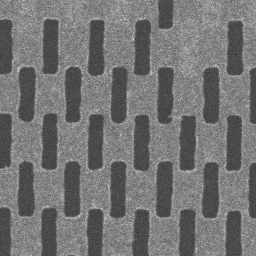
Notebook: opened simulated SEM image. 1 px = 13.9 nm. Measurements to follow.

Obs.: a regular array of holes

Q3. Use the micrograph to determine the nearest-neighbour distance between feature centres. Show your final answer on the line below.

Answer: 642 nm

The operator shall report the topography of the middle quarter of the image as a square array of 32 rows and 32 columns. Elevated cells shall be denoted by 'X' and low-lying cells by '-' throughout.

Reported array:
XXXXXX----XXXXXXX-----XXXXXXXXXX
X---XX----XX----X-----X----XXXXX
----XX----XX----X----XX-----XXXX
-----XXXXXXX----XXXXXXX-----XXXX
----XXXXXXXX----XXXXXXX-----XXXX
----XXXXXXXX----XXXXXXXX---XXXXX
----XXXXXXXX----XXXXXXXX---XXXXX
----XXXXXXXX----XXXXXXX----XXXXX
-----XXXXXXX----XXXXXXX-----XXXX
----XXXXXXXX----XXXXXXX-----XXXX
----XXXXXXXX----XXXXXXX-----XXXX
----XXXXXXXX----XXXXXXX----XXXXX
----XXX--XXX----XXXXXXX----XXXXX
----XX----XX----XX---XX----XX---
X---XX----XX---XXX----XX---XX---
XXXXXX----XXXXXXXX----XXXXXXX---
XXXXXX----XXXXXXXX---XXXXXXXX---
XXXXXX----XXXXXXX-----XXXXXXX---
XXXXXX----XXXXXXX-----XXXXXXX---
XXXXXX----XXXXXXX----XXXXXXXX---
XXXXXX----XXXXXXX----XXXXXXXX---
XXXXXX----XXXXXXX----XXXXXXXX---
XXXXXX----XXXXXXX----XXXXXXXX---
XXXXXX----XXXXXXX----XXXXXXXX---
X--XXX----XX---XX----XXX---XX---
----XX----XX----X----XX----XX---
----XX--XXX-----XX---XX----XX---
----XXXXXXXX----XXXXXXX----XXXXX
----XXXXXXX-----XXXXXXX----XXXXX
----XXXXXXX----XXXXXXXX----XXXXX
----XXXXXXX----XXXXXXXX----XXXXX
----XXXXXXX-----XXXXXXX----XXXXX